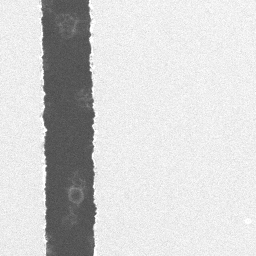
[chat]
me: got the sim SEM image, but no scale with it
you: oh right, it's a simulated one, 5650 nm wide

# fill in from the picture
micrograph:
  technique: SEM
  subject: one or a few lines or trenches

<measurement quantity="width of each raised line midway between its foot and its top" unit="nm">1120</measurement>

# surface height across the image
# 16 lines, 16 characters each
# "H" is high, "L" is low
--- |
LLLHHHLLLLLLLLLL
LLLHHHLLLLLLLLLL
LLLHHHLLLLLLLLLL
LLLHHHLLLLLLLLLL
LLLHHHLLLLLLLLLL
LLLHHHLLLLLLLLLL
LLLHHHLLLLLLLLLL
LLLHHHLLLLLLLLLL
LLLHHHLLLLLLLLLL
LLLHHHLLLLLLLLLL
LLLHHHLLLLLLLLLL
LLLHHHLLLLLLLLLL
LLLHHHLLLLLLLLLL
LLLHHHLLLLLLLLLL
LLLHHHLLLLLLLLLL
LLLHHHLLLLLLLLLL